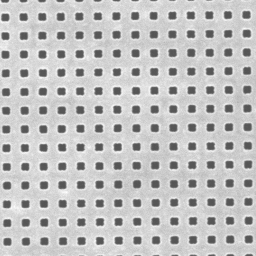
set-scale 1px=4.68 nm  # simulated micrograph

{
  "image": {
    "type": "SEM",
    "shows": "a regular array of holes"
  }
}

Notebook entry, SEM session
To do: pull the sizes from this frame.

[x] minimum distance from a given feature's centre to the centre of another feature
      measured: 18.2 px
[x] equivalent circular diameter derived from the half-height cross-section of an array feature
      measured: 42.6 nm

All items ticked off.